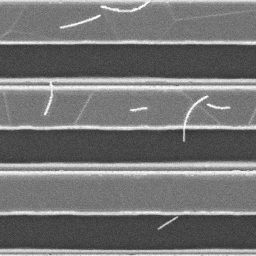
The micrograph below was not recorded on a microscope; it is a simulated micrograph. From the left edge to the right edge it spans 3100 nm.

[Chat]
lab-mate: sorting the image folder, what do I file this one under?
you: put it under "lines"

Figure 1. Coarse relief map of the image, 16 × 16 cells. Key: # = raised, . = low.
################
################
################
................
................
################
################
################
................
................
................
################
################
................
................
................